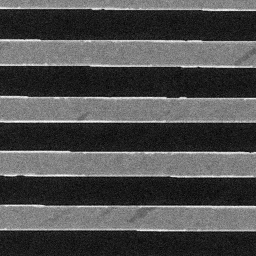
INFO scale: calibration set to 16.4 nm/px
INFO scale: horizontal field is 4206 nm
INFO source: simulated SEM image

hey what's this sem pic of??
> lines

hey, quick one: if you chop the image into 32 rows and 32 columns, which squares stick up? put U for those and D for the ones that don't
UUUUUUUUUUUUUUUUUUUUUUUUUUUUUUUU
DDDDDDDDDDDDDDDDDDDDDDDDDDDDDDDD
DDDDDDDDDDDDDDDDDDDDDDDDDDDDDDDD
DDDDDDDDDDDDDDDDDDDDDDDDDDDDDDDD
DDDDDDDDDDDDDDDDDDDDDDDDDDDDDDDD
UUUUUUUUUUUUUUUUUUUUUUUUUUUUUUUU
UUUUUUUUUUUUUUUUUUUUUUUUUUUUUUUU
UUUUUUUUUUUUUUUUUUUUUUUUUUUUUUUU
DDDDDDDDDDDDDDDDDDDDDDDDDDDDDDDD
DDDDDDDDDDDDDDDDDDDDDDDDDDDDDDDD
DDDDDDDDDDDDDDDDDDDDDDDDDDDDDDDD
DDDDDDDDDDDDDDDDDDDDDDDDDDDDDDDD
UUUUUUUUUUUUUUUUUUUUUUUUUUUUUUUU
UUUUUUUUUUUUUUUUUUUUUUUUUUUUUUUU
UUUUUUUUUUUUUUUUUUUUUUUUUUUUUUUU
DDDDDDDDDDDDDDDDDDDDDDDDDDDDDDDD
DDDDDDDDDDDDDDDDDDDDDDDDDDDDDDDD
DDDDDDDDDDDDDDDDDDDDDDDDDDDDDDDD
DDDDDDDDDDDDDDDDDDDDDDDDDDDDDDDD
UUUUUUUUUUUUUUUUUUUUUUUUUUUUUUUU
UUUUUUUUUUUUUUUUUUUUUUUUUUUUUUUU
UUUUUUUUUUUUUUUUUUUUUUUUUUUUUUUU
DDDDDDDDDDDDDDDDDDDDDDDDDDDDDDDD
DDDDDDDDDDDDDDDDDDDDDDDDDDDDDDDD
DDDDDDDDDDDDDDDDDDDDDDDDDDDDDDDD
DDDDDDDDDDDDDDDDDDDDDDDDDDDDDDDD
UUUUUUUUUUUUUUUUUUUUUUUUUUUUUUUU
UUUUUUUUUUUUUUUUUUUUUUUUUUUUUUUU
UUUUUUUUUUUUUUUUUUUUUUUUUUUUUUUU
DDDDDDDDDDDDDDDDDDDDDDDDDDDDDDDD
DDDDDDDDDDDDDDDDDDDDDDDDDDDDDDDD
DDDDDDDDDDDDDDDDDDDDDDDDDDDDDDDD